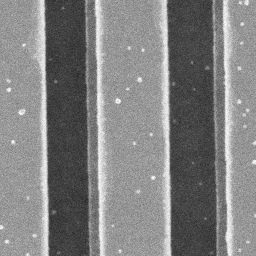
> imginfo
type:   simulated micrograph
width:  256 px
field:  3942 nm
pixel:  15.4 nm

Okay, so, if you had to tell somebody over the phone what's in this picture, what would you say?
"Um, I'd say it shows lines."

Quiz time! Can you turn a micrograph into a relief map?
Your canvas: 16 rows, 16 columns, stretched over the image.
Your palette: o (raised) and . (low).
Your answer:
ooo..ooooo...ooo
ooo..ooooo...ooo
ooo..ooooo...ooo
ooo..ooooo...ooo
ooo..oooooo..ooo
ooo..oooooo..ooo
ooo..oooooo..ooo
ooo...ooooo..ooo
ooo...ooooo...oo
ooo...ooooo...oo
ooo...ooooo...oo
ooo...ooooo...oo
ooo...ooooo...oo
ooo...ooooo...oo
ooo...ooooo...oo
ooo...ooooo...oo